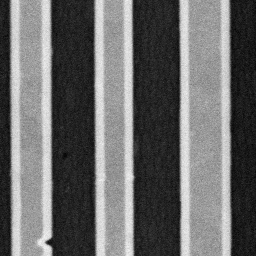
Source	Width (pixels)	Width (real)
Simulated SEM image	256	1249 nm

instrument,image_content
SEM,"one or a few lines or trenches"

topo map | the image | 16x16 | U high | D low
DUUDDDUUDDDUUUDD
DUUDDDUUDDDUUUDD
DUUDDDUUDDDDUUDD
DUUDDDUUDDDDUUDD
DUUDDDUUDDDDUUDD
DUUDDDUUDDDDUUDD
DUUDDDUUDDDDUUDD
DUUDDDUUDDDDUUDD
DUUDDDUUDDDDUUDD
DUUDDDUUDDDDUUDD
DUUDDDUUDDDDUUDD
DUUDDDUUDDDDUUDD
DUUDDDUUDDDDUUDD
DUUDDDUUDDDDUUDD
DUUDDDUUDDDDUUDD
DUUDDDUUDDDDUUDD